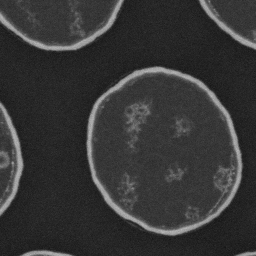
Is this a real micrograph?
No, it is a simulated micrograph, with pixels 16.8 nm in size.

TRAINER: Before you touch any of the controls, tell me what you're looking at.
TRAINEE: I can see raised bodies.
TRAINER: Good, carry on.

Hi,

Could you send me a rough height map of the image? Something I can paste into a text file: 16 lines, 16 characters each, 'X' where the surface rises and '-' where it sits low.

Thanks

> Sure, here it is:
XXXXXXX------XXX
XXXXXXX-------XX
--XXXX---------X
----------------
---------XX-----
-------XXXXXX---
------XXXXXXXX--
X-----XXXXXXXX--
X-----XXXXXXXXX-
X-----XXXXXXXXX-
X-----XXXXXXXXX-
X-----XXXXXXXXX-
X------XXXXXXX--
--------XXXXX---
----------X-----
----------------